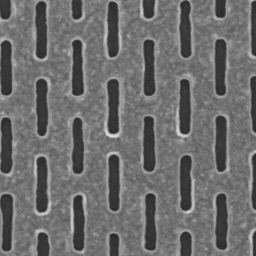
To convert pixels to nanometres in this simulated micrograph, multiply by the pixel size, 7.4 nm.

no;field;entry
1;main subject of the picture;a regular array of holes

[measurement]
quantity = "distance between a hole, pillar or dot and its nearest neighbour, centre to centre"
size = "384 nm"